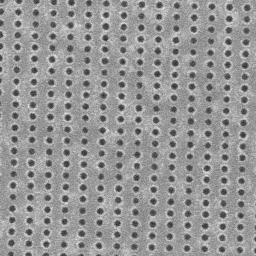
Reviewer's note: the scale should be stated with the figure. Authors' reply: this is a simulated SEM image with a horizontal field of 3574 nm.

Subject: a regular array of holes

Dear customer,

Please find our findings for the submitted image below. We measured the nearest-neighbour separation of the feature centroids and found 159 nanometers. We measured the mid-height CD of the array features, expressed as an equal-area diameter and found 102 nm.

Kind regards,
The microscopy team